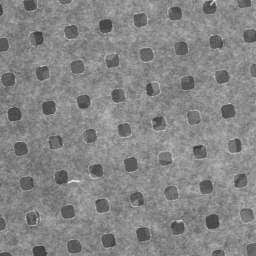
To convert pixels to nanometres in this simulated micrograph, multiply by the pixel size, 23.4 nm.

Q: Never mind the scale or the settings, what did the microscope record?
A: a regular array of raised bodies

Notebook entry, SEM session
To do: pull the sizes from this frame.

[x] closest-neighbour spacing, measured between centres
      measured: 35 pixels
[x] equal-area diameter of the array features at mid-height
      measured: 358 nm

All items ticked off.